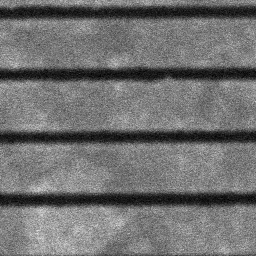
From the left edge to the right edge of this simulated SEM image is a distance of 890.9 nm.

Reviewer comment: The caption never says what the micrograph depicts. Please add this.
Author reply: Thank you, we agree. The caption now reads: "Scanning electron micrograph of one or a few lines or trenches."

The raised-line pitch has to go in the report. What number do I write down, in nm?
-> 217